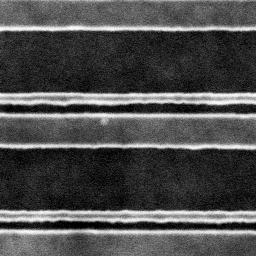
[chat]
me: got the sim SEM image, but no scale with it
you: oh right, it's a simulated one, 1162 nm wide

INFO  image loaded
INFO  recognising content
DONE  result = lines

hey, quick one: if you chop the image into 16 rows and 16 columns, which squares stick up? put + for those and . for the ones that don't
++++++++++++++++
++++++++++++++++
................
................
................
................
++++++++++++++++
++++++++++++++++
++++++++++++++++
................
................
................
................
++++++++++++++++
++++++++++++++++
++++++++++++++++